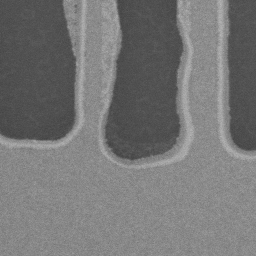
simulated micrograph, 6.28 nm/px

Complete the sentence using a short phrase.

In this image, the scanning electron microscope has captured one or a few lines or trenches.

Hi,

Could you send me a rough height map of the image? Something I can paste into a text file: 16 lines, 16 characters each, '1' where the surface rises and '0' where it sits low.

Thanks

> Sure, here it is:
0000011000011100
0000011000011100
0000011000001100
0000011000001100
0000011000001100
0000011000001100
0000011000001100
0000010000001100
0000110000001100
1111111000011110
1111111111111111
1111111111111111
1111111111111111
1111111111111111
1111111111111111
1111111111111111